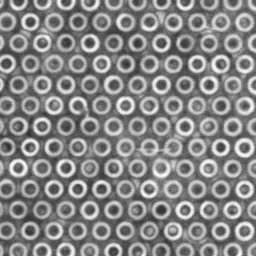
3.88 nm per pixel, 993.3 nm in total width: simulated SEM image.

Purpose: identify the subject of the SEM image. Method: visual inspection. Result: a regular array of ring-shaped raised bodies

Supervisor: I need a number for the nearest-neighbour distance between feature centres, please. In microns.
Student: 0.0911